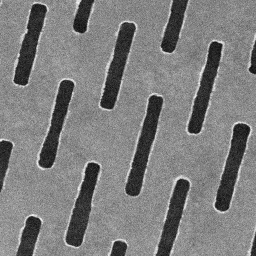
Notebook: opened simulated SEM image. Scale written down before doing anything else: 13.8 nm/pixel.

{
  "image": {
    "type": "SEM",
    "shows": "holes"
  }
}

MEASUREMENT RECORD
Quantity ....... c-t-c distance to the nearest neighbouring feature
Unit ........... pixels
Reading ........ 84.3